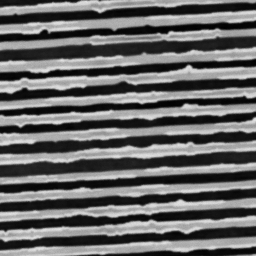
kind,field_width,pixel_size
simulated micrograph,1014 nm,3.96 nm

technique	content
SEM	parallel lines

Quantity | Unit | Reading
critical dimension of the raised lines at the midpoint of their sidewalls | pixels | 10.5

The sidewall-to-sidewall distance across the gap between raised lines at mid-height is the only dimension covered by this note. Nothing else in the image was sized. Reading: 34.1 nm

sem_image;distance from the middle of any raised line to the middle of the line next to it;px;18.7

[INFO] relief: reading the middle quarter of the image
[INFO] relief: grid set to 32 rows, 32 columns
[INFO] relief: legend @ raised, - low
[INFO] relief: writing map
@@@@@@@@@@@@@-@@---------------@
-@--------------------------@@@@
------------------@@@@@@@@@@@@@@
@@@@@@@@@@@@@@@@@@@@@@@@@@@@@@@@
@@@@@@@@@@@@@@@@@@@@@@@@@@------
@@@@@@@@------------------------
--------------------------------
---------------@@@@@@@@@@@@@@@@@
@@@@@@@@@@@@@@@@@@@@@@@@@@@@@@@@
@@@@@@@@@@@@@@@@@@@@@@@---------
---@@-------------------------@@
-----------------@@@@@@@@@@@@@@@
@@@@@@@@@@@@@@@@@@@@@@@@@@@@@@@@
@@@@@@@@@@@@@@@@@@@@@@@---------
@@------------------------------
-----------------------@@@@@@@@@
-----@@@@@@@@@@@@@@@@@@@@@@@@@@@
@@@@@@@@@@@@@@@@@@@@@@@@@@@@@@@-
@@@@@@@@@@@@@-------------------
--------------------------------
----------------@----@@@@@@@@@@@
------@@@@@@@@@@@@@@@@@@@@@@@@@@
@@@@@@@@@@@@@@@@@@@@@@@@@@@@@@@@
@@@@@@@@@@@@@@-----@@@----------
@@------------------------------
--------------------------------
----------------@@@@@@@@@@@@@@@@
@@@@@@@@@@@@@@@@@@@@@@@@@@@@@@@@
@@@@@@@@@@@@@@@-----------------
@-------------------------------
-----------------@@@@@@@@@@@@@@@
@@@@@@@@@@@@@@@@@@@@@@@@@@@@@@@@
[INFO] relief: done